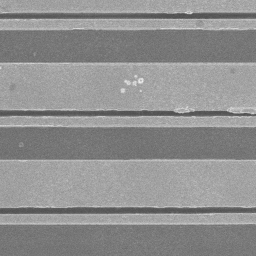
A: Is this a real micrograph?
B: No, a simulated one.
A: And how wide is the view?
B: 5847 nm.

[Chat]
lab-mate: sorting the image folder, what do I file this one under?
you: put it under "lines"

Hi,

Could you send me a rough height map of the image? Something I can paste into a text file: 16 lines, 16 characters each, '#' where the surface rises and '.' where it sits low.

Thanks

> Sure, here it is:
################
################
................
................
################
################
################
################
................
................
################
################
################
################
................
................